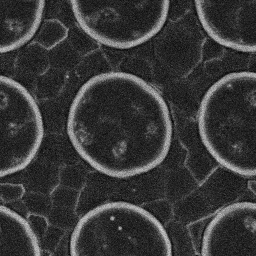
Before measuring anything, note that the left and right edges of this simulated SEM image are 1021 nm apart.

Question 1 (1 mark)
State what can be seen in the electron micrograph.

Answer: raised bodies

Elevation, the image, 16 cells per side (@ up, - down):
@@@--@@@@@--@@@@
@@---@@@@@---@@@
@@----@@@-----@@
----------------
----------------
@----@@@@----@@@
@@---@@@@@---@@@
@@--@@@@@@@--@@@
@@--@@@@@@@--@@@
@@---@@@@@---@@@
@-----@@@-----@@
----------------
----------------
@-----@@@-----@@
@@---@@@@@---@@@
@@---@@@@@@--@@@